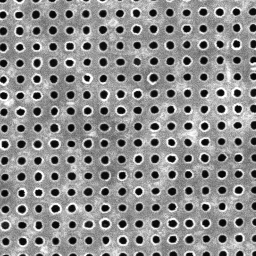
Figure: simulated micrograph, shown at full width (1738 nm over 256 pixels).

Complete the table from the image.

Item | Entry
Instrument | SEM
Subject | a regular array of holes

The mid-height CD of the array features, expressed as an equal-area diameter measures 51.4 nm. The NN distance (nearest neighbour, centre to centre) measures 0.109 micrometres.